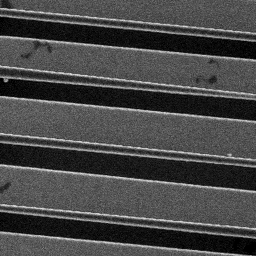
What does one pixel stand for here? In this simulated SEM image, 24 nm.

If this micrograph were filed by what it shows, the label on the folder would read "lines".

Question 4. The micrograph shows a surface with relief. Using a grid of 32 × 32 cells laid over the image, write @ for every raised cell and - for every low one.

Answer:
@@@@@@@@@@@@@@@@@@@@@@@@@@@@@@@@
@@@@@@@@@@@@@@@@@@@@@@@@@@@@@@@@
-----@@@@@@@@@@@@@@@@@@@@@@@@@@@
---------------@@@@@@@@@@@@@@@@@
--------------------------@@@@@@
@@@@@@@@@@----------------------
@@@@@@@@@@@@@@@@@@@@@@----------
@@@@@@@@@@@@@@@@@@@@@@@@@@@@@@@@
@@@@@@@@@@@@@@@@@@@@@@@@@@@@@@@@
@@@@@@@@@@@@@@@@@@@@@@@@@@@@@@@@
---------@@@@@@@@@@@@@@@@@@@@@@@
---------------------@@@@@@@@@@@
@@@@@---------------------------
@@@@@@@@@@@@@@------------------
@@@@@@@@@@@@@@@@@@@@@@@@@-------
@@@@@@@@@@@@@@@@@@@@@@@@@@@@@@@@
@@@@@@@@@@@@@@@@@@@@@@@@@@@@@@@@
@@@@@@@@@@@@@@@@@@@@@@@@@@@@@@@@
--------@@@@@@@@@@@@@@@@@@@@@@@@
------------------@@@@@@@@@@@@@@
----------------------------@@@@
@@@@@@@@@-----------------------
@@@@@@@@@@@@@@@@@@--------------
@@@@@@@@@@@@@@@@@@@@@@@@@@@@----
@@@@@@@@@@@@@@@@@@@@@@@@@@@@@@@@
@@@@@@@@@@@@@@@@@@@@@@@@@@@@@@@@
-@@@@@@@@@@@@@@@@@@@@@@@@@@@@@@@
----------@@@@@@@@@@@@@@@@@@@@@@
--------------------@@@@@@@@@@@@
@@@@@@-----------------------@@@
@@@@@@@@@@@@@@@@----------------
@@@@@@@@@@@@@@@@@@@@@@@@@@------